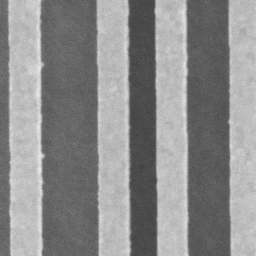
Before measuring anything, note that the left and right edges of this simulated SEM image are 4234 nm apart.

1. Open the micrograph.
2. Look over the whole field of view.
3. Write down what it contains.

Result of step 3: lines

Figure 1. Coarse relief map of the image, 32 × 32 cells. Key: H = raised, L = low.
LHHHHLLLLLLLHHHHLLLLHHHLLLLLLHHH
LHHHHLLLLLLLHHHHLLLHHHHLLLLLLHHH
LHHHHLLLLLLLHHHHLLLLHHHLLLLLLHHH
LHHHHLLLLLLLHHHHLLLLHHHLLLLLLHHH
LHHHHLLLLLLLHHHHLLLLHHHLLLLLLHHH
LHHHHLLLLLLLHHHHLLLLHHHLLLLLLHHH
LHHHHLLLLLLLHHHHLLLLHHHLLLLLLHHH
LHHHHLLLLLLLHHHHLLLLHHHLLLLLLHHH
LHHHHLLLLLLLHHHHLLLLHHHLLLLLLHHH
LHHHHLLLLLLLHHHHLLLLHHHLLLLLLHHH
LHHHHLLLLLLLHHHHLLLLHHHLLLLLLHHH
LHHHHLLLLLLLHHHHLLLLHHHLLLLLLHHH
LHHHHLLLLLLLHHHHLLLLHHHLLLLLLHHH
LHHHHLLLLLLLHHHHLLLLHHHLLLLLLHHH
LHHHHLLLLLLLHHHHLLLLHHHLLLLLLHHH
LHHHHLLLLLLLHHHHLLLLHHHLLLLLLHHH
LHHHHLLLLLLLHHHHLLLLHHHLLLLLLHHH
LHHHHLLLLLLLHHHHLLLLHHHLLLLLLHHH
LHHHHLLLLLLLHHHHLLLLHHHLLLLLLHHH
LHHHHLLLLLLLHHHHLLLLHHHLLLLLLHHH
LHHHHLLLLLLLHHHHLLLLHHHLLLLLLHHH
LHHHHLLLLLLLHHHHLLLLHHHLLLLLLHHH
LHHHHLLLLLLLHHHHLLLLHHHLLLLLLHHH
LHHHHLLLLLLLHHHHLLLLHHHLLLLLLHHH
LHHHHLLLLLLLHHHHLLLLHHHLLLLLLHHH
LHHHHLLLLLLLHHHHLLLLHHHLLLLLLHHH
LHHHHLLLLLLLHHHHLLLLHHHLLLLLLHHH
LHHHHLLLLLLLHHHHLLLLHHHLLLLLLHHH
LHHHHLLLLLLLHHHHLLLLHHHLLLLLLHHH
LHHHHLLLLLLLHHHHLLLLHHHLLLLLLHHH
LHHHHLLLLLLLHHHHLLLLHHHLLLLLLHHH
LHHHHLLLLLLLHHHHLLLLHHHLLLLLLHHH